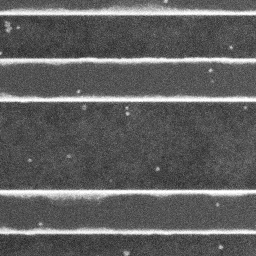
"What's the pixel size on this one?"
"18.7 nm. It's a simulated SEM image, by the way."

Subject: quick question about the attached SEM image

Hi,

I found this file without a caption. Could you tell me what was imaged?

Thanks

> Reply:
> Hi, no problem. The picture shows lines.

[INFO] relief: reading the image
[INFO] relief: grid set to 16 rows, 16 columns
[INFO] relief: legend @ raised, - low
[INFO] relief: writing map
@@@@@@@@@@@@@@@@
----------------
----------------
----------------
@@@@@@@@@@@@@@@@
@@@@@@@@@@@@@@@@
----------------
----------------
----------------
----------------
----------------
----------------
@@@@@@@@@@@@@@@@
@@@@@@@@@@@@@@@@
@@@@@@@@@@@@@@@@
----------------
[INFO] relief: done